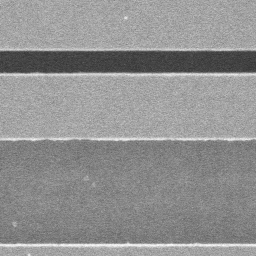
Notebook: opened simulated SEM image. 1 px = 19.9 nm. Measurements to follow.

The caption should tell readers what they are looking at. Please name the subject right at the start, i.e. lines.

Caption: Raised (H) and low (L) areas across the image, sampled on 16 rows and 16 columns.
HHHHHHHHHHHHHHHH
HHHHHHHHHHHHHHHH
HHHHHHHHHHHHHHHH
LLLLLLLLLLLLLLLL
LLLLLLLLLLLLLLLL
HHHHHHHHHHHHHHHH
HHHHHHHHHHHHHHHH
HHHHHHHHHHHHHHHH
HHHHHHHHHHHHHHHH
LLLLLLLLLLLLLLLL
LLLLLLLLLLLLLLLL
LLLLLLLLLLLLLLLL
LLLLLLLLLLLLLLLL
LLLLLLLLLLLLLLLL
LLLLLLLLLLLLLLLL
HHHHHHHHHHHHHHHH